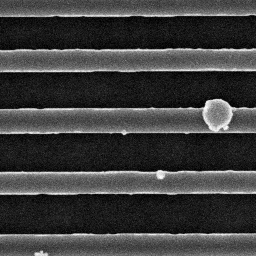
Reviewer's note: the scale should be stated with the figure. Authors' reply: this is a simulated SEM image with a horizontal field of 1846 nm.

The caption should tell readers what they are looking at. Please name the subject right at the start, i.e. lines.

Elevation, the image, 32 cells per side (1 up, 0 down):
11111111111111111111111111111111
11111111111111111111111111111111
00000000000000000000000000000000
00000000000000000000000000000000
00000000000000000000000000000000
00000000000000000000000000000000
11111111111111111111111111111111
11111111111111111111111111111111
11111111111111111111111111111111
00000000000000000000000000000000
00000000000000000000000000000000
00000000000000000000000000000000
00000000000000000000000000110000
00000000000000000010001111111111
11111111111111111111111111111111
11111111111111111111111111111111
11111111111111111111111111111111
00000000000000000000000000000000
00000000000000000000000000000000
00000000000000000000000000000000
00000000000000000000000000000000
00000000000000111001101111111111
11111111111111111111111111111111
11111111111111111111111111111111
00000000000000000000000000000000
00000000000000000000000000000000
00000000000000000000000000000000
00000000000000000000000000000000
00000000000000000000000000000000
11111111111111111111111111111111
11111111111111111111111111111111
11111111111111111111111111111111